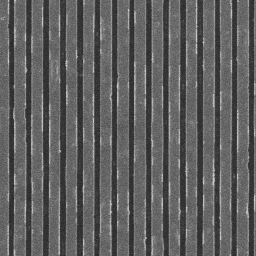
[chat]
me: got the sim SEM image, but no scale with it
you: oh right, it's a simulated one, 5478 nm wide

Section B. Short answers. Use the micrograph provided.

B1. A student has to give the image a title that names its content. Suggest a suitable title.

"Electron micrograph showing parallel lines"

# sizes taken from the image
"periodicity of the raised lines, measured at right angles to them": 17.2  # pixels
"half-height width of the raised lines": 230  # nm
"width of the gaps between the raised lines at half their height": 134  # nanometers